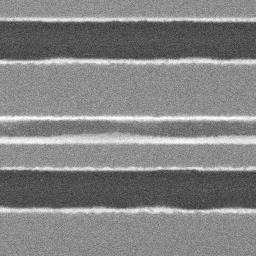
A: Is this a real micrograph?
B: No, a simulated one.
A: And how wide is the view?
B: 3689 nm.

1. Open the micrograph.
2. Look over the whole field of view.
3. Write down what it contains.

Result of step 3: lines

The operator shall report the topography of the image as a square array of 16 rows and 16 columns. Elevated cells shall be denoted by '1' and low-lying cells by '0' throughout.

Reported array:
1111111111111111
0000000000000000
0000000000000000
0000000000000000
1111111111111111
1111111111111111
1111111111111111
1111111111111111
1111111111111111
1111111111111111
1111111111111111
0000000000000000
0000000000000000
1111111111111111
1111111111111111
1111111111111111